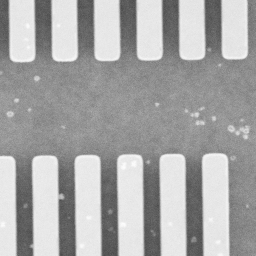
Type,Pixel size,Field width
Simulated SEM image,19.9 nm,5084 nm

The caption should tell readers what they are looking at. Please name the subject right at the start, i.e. groups of lines, slits or small figures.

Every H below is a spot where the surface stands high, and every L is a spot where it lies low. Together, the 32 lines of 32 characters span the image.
LHHHLLLHHLLLHHHLLHHHLLHHHLLLHHHL
LHHHLLLHHLLLHHHLLHHHLLLHHLLLHHHL
LHHHLLLHHHLLHHHLLHHHLLLHHLLLHHHL
LHHHLLLHHHLLHHHLLHHHLLLHHLLLHHHL
LHHHLLLHHHLLHHHLLHHHLLLHHLLLHHHL
LHHHLLLHHHLLHHHLLHHHLLLHHLLLHHHL
LHHHLLLHHHLLHHHLLHHHLLLHHLLLHHHL
LLHHLLLHHLLLLLLLLLLLLLLLLLLLLLLL
LLLLLLLLLLLLLLLLLLLLLLLLLLLLLLLL
LLLLLLLLLLLLLLLLLLLLLLLLLLLLLLLL
LLLLLLLLLLLLLLLLLLLLLLLLLLLLLLLL
LLLLLLLLLLLLLLLLLLLLLLLLLLLLLLLL
LLLLLLLLLLLLLLLLLLLLLLLLLLLLLLLL
LLLLLLLLLLLLLLLLLLLLLLLLLLLLLLLL
LLLLLLLLLLLLLLLLLLLLLLLLLLLLLLLL
LLLLLLLLLLLLLLLLLLLLLLLLLLLLLLLL
LLLLLLLLLLLLLLLLLLLLLLLLLLLLLLLL
LLLLLLLLLLLLLLLLLLLLLLLLLLLLLLLL
LLLLLLLLLLLLLLLLLLLLLLLLLLLLLLLL
LLLLLLLLLLLLLLLHHLLLLHHLLLHHLLLL
HHLLHHHLLHHHLLLHHHLLHHHLLHHHLLLL
HHLLHHHLLHHHLLLHHHLLHHHLLHHHLLLL
HHLLHHHLLHHHHLLHHHLLHHHLLHHHLLLL
HHLLHHHLLHHHHLLHHHLLHHHLLHHHLLLL
HHLLHHHLLHHHHLLHHHLLHHHLLHHHLLLL
HHLLHHHLLLHHHLLHHHLLHHHLLHHHLLLL
HHLLHHHLLLHHHLLHHHLLHHHLLHHHLLLL
HHLLHHHLLLHHHLLHHHLLHHHLLHHHLLLL
HHLLHHHLLLHHHLLHHHLLHHHLLHHHHLLL
HHLLHHHLLLHHHLLHHHLLHHHLLHHHHLLL
HHLLHHHLLLHHHLLHHHLLHHHLLHHHHLLL
HHLLHHHLLLHHHLLHHHLLHHHLLLHHHLLL